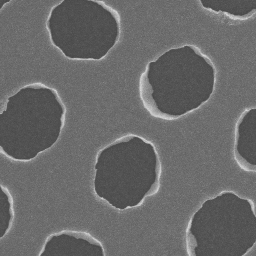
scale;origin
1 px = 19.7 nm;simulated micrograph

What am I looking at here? holes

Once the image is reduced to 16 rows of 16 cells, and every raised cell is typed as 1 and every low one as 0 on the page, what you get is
1110000111111000
1110000111111111
1110000111111111
1111001111000111
1111111110000111
1101111110000111
0000111110000111
0000111111111110
0000111111111110
0001110000111110
1111110000111111
1111110000111111
0111111001111001
0111111111110000
1111111111110000
1110001111110000